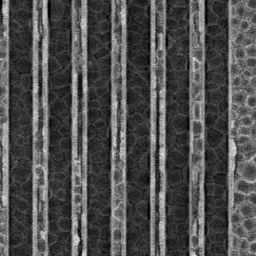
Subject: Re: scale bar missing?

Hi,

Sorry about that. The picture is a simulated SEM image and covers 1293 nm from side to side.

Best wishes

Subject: parallel lines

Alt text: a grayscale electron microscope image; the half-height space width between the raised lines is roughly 128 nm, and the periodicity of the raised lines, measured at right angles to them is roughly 198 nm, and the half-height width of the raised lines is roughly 70.8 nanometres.